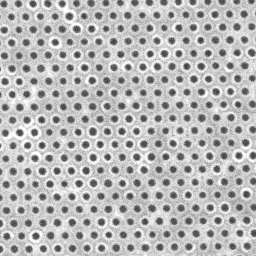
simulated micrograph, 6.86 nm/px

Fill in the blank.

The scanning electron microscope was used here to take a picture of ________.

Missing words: a regular array of holes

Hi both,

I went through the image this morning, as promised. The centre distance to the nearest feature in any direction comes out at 98.3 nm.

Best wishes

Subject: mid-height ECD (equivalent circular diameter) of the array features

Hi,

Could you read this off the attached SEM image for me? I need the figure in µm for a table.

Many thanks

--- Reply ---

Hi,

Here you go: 0.0579